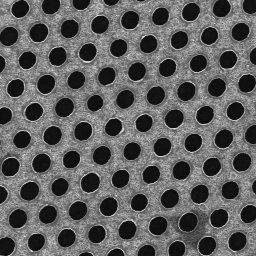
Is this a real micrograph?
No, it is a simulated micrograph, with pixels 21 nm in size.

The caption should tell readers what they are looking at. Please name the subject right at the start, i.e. a regular array of holes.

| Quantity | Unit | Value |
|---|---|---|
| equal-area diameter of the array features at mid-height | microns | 0.38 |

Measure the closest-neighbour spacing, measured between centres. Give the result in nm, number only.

626